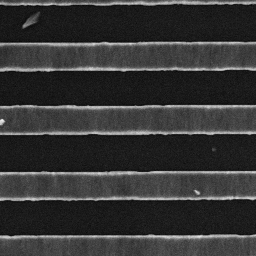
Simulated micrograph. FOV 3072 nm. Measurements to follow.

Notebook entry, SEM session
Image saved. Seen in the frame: lines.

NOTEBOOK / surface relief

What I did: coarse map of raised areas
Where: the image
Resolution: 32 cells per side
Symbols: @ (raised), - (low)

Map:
@@@@@@@@@@@@@@@@@@@@@@-@@@@@@@@@
--------------------------------
--------------------------------
--------------------------------
--------------------------------
@@@@@@@@@@@@@@@@@@@@@@@@@@@@@@@@
@@@@@@@@@@@@@@@@@@@@@@@@@@@@@@@@
@@@@@@@@@@@@@@@@@@@@@@@@@@@@@@@@
@@@@@@@@@@@@@@@@@@@@@@@@@@@@@@@@
--------------------------------
--------------------------------
--------------------------------
--------------------------------
@@@@@@@@@@@@@@@@@@@@@@@@@@@@@@@@
@@@@@@@@@@@@@@@@@@@@@@@@@@@@@@@@
@@@@@@@@@@@@@@@@@@@@@@@@@@@@@@@@
@@@@@@@@@@@@@@@@@@@@@@@@@@@@@@@@
--------------------------------
--------------------------------
--------------------------------
--------------------------------
-------------@@@@-@@@@@@@@@@@@@@
@@@@@@@@@@@@@@@@@@@@@@@@@@@@@@@@
@@@@@@@@@@@@@@@@@@@@@@@@@@@@@@@@
@@@@@@@@@@@@@@@@@@@@@@@@@@@@@@@@
--------------------------------
--------------------------------
--------------------------------
--------------------------------
@@@@@@@@@@@@@@@@@@@@@@@@@@@@@@@@
@@@@@@@@@@@@@@@@@@@@@@@@@@@@@@@@
@@@@@@@@@@@@@@@@@@@@@@@@@@@@@@@@